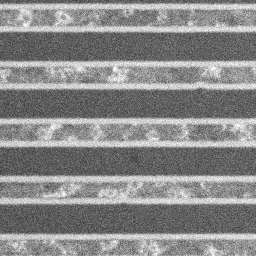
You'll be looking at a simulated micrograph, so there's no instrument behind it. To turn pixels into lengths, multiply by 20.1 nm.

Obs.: parallel lines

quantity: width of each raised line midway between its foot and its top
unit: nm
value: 685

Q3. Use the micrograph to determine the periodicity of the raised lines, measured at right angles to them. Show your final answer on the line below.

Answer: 1150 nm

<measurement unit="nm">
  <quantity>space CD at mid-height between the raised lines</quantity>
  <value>464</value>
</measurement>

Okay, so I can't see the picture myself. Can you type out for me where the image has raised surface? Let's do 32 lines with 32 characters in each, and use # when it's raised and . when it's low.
################################
................................
................................
................................
################################
################################
################################
################################
................................
................................
................................
################################
################################
################################
################################
................................
................................
................................
################################
################################
################################
################################
................................
................................
................................
################################
################################
################################
################################
################################
................................
................................